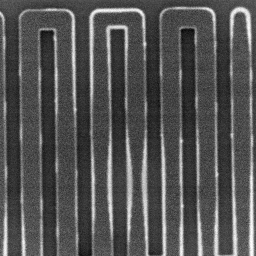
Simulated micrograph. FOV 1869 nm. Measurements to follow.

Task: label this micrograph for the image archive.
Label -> groups of lines, slits or small figures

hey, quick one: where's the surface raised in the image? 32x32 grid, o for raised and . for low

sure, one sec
................................
...oooooo...oooooo..oooooo...oo.
..ooooooo..ooooooo..ooooooo..oo.
o.ooooooo..ooo.ooo..ooo.ooo..oo.
o..oo..oo..ooo..oo..oo..ooo..oo.
o..oo..oo..ooo..oo..oo..ooo..oo.
o..oo..oo..ooo..oo..ooo.ooo..oo.
o..oo..oo..ooo..oo..ooo.ooo..oo.
o..oo..oo..ooo..oo..ooo..oo..oo.
o..oo..oo..ooo..oo..ooo..oo..oo.
o..oo..oo..ooo..oo..ooo..oo..oo.
o..oo..oo..ooo..oo..ooo..oo..oo.
o..oo..oo..ooo..oo..ooo..oo..oo.
o..oo..oo..ooo..oo..ooo..oo..oo.
o..oo..oo..ooo..oo..ooo..oo..oo.
o..oo..oo..ooo..oo..ooo..oo..oo.
o..oo..oo..ooo..oo..ooo..oo..oo.
o..oo..oo..ooo..oo..ooo..oo..oo.
o..oo..ooo..oo..oo..ooo..oo..oo.
o..oo..ooo..oo..oo..ooo..oo..oo.
o..oo..ooo..oo..oo..ooo..oo..oo.
o..oo..ooo..oo..oo..ooo..oo..oo.
o..oo..ooo..oo..oo..ooo..oo..oo.
o..oo..ooo..oo..oo...oo..oo..oo.
o..oo..ooo..oo..oo...oo..oo..oo.
o..oo..ooo..oo..oo...oo..oo..oo.
o..oo..ooo..oo..oo...oo..oo..oo.
o..oo..ooo..oo..oo...oo..oo..oo.
o..oo..ooo..oo..oo...oo..oo..oo.
o..oo..ooo..oo..oo...oo..oo..oo.
o..oo..ooo..oo..oo...oo..oo..oo.
o..oo..ooo..oo..oo...oo..oo..oo.